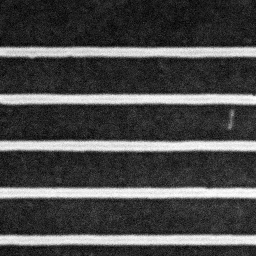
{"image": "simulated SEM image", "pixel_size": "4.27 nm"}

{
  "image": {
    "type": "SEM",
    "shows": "parallel lines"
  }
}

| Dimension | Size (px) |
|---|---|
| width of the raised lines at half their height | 7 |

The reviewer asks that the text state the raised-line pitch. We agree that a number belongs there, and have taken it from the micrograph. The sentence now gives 201 nanometers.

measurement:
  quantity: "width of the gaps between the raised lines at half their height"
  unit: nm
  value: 171